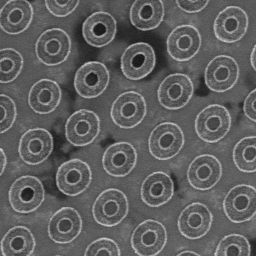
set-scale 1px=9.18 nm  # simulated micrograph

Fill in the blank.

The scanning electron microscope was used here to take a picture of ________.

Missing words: a regular array of ring-shaped raised bodies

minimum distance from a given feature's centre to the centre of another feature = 448 nm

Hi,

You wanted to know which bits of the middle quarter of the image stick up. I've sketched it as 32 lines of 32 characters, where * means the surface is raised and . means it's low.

.....*****....***..***..........
....*******....*******..........
...***..***....******...........
...**....**.....***.......*****.
...**....**..............*******
...***..***....**.......***..***
...*******..............**...***
....*****......***......**...***
..............******....***..**.
.............*******....*******.
............***...**.....*****..
....*.......**....**............
..******....**...***............
.*******....********............
.***..***....******.............
***...***.....***......*****....
.**...***..............******...
.**..***..............***..**...
.******..............***....**..
..*****..............***...***..
............*****....***..***...
...........*******...********...
..........***..***....******....
..........**....**......**......
.***......**...***..............
******....***.***..............*
**.***....******...............*
*...***.....****......***......*
*...***..............*****.....*
*..***..............*******.....
******..............**...**.....
*****......**.......**...**.....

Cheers